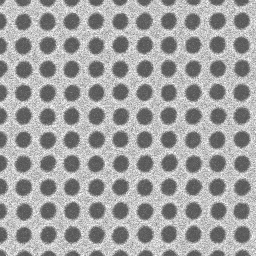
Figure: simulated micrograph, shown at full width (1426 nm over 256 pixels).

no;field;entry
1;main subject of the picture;a regular array of holes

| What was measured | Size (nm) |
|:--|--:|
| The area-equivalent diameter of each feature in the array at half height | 96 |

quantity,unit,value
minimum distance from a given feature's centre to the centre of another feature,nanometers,130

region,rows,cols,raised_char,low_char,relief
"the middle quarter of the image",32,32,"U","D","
DDDDUUDDDDUUDDDDUUDDDDUUDDDDUUDD
DDDDUUDDDDUUDDDDUUDDDDUUDDDDUUDD
DDDDUUDDDDUUDDDDUUDDDDUUDDDDUUDD
UDUUUUUUUUUUUDDUUUUUDUUUUUUUUUUU
UUUUUUUUUUUUUUUUUUUUUUUUUUUUUUUU
UDDUUUUDDUUUUDDDUUUDDDUUUDDDUUUD
DDDDUUDDDDUUDDDDUUDDDDUUDDDDUUDD
DDDDUUDDDDUUDDDDUUDDDDUUDDDDUUDD
DDDDUUUDDDUUUDDUUUUDDDUUDDDDUUUD
UUUUUUUUUUUUUUUUUUUUUUUUUUUUUUUU
UUUUUUUUUUUUUUUUUUUUUUUUUUUUUUUU
UDDUUUUDDDUUUDDDUUUDDDUUUDDDUUUD
DDDDUUDDDDUUDDDDUUDDDDUUDDDDUUDD
DDDDUUDDDDUUDDDDUUDDDDUUDDDDUUDD
DDDDUUUDDDUUDDDDUUDDDDUUDDDUUUUD
UUUUUUUUUUUUUUUUUUUUUUUUUUUUUUUU
UUUUUUUUUUUUUUUUUUUUUUUUUUUUUUUU
DDDDUUUDDDUUUDDDUUUDDDUUUDDDUUUD
DDDDUUDDDDUUDDDDUUDDDDUUDDDDUUDD
DDDDUUDDDDUUDDDDUUDDDDUUDDDDUUDD
DDDUUUUDDUUUUDDUUUDDDDUUUDDDUUUD
UUUUUUUUUUUUUUUUUUUUUUUUUUUUUUUU
UUUUUUUUUUUUUUUUUUUUUUUUUUDUUUUU
DDDDUUUDDDUUUDDDUUUDDDUUUDDDUUUD
DDDDUUDDDDUUDDDDUUDDDDDUDDDDUUDD
DDDDUUDDDDUUDDDDUUDDDDUUDDDDUUDD
DDDUUUDDDUUUUDDUUUUDDDUUUDDUUUUD
UUUUUUUUUUUUUUUUUUUUUUUUUUUUUUUU
UUUUUUUUUUUUUUUUUUUUUUUUUUUUUUUU
DDDDUUUDDDUUDDDDUUDDDDUUUDDDUUUD
DDDDUUDDDDUUDDDDUUDDDDUUDDDDUUDD
DDDDUUDDDDUUDDDDUUDDDDUUDDDDUUDD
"